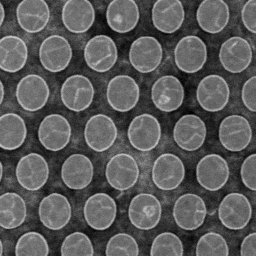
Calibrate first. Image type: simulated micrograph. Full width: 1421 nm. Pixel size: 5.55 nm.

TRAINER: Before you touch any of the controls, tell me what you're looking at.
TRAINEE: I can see a regular array of raised bodies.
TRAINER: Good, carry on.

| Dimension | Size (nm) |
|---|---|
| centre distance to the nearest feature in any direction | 249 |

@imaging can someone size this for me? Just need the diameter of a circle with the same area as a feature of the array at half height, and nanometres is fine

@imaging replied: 186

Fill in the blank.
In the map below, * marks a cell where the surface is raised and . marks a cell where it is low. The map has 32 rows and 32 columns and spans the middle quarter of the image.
*.....******.....******......***
........***........***.......***
................................
.****........****.......****....
******.....*******.....******...
*******....*******....*******...
*******....*******....********..
*******....*******....********..
*******....*******....********..
*******....*******....*******...
.*****......******.....******...
..**..........**.........**.....
................................
.......****.......****.......***
*.....******.....******......***
*....********....*******....****
*....********...********....****
*....********...********....****
*....********...********....****
*.....******.....******.....****
......******.....******......***
........**..........*...........
................................
.*****......*****.......****....
*******....*******.....******...
*******....*******.....*******..
*******....*******....********..
*******....*******....********..
*******....*******....********..
******.....*******.....******...
.****.......*****......*****....
................................